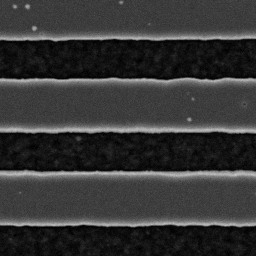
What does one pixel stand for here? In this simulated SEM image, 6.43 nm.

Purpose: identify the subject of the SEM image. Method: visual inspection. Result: lines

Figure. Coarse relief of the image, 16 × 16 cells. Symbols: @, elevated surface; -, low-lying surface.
@@@@@@@@@@@@@@@@
@@@@@@@@@@@@@@@@
@@@@@----@@-----
----------------
----------------
@@@@@@@@@@@@@@@@
@@@@@@@@@@@@@@@@
@@@@@@@@@@@@@@@@
----------------
----------------
----------------
@@@@@@@@@@@@@@@@
@@@@@@@@@@@@@@@@
@@@@@@@@@@@@@@@@
----------------
----------------